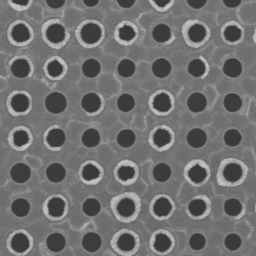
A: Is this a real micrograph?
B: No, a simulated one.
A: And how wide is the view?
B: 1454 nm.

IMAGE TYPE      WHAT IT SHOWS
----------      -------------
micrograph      a regular array of holes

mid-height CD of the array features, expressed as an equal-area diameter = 105 nm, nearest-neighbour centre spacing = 197 nanometers